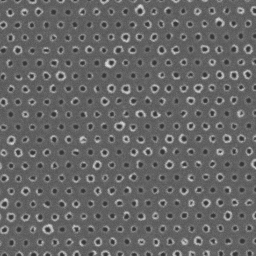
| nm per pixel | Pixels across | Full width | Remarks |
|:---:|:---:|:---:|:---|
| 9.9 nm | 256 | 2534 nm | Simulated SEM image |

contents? a regular array of holes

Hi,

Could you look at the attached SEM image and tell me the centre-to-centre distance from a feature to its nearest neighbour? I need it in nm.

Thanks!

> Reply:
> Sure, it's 140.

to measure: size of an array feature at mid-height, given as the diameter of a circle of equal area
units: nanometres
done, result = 47.4